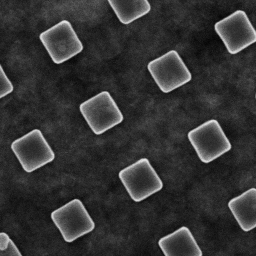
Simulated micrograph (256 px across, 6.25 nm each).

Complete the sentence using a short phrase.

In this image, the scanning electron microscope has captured raised bodies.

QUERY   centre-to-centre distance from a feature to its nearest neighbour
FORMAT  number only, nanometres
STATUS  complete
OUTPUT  495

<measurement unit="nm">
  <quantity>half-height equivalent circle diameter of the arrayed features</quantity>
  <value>233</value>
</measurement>